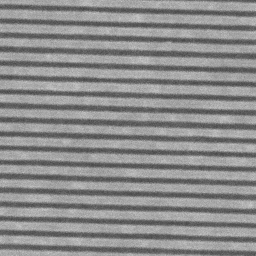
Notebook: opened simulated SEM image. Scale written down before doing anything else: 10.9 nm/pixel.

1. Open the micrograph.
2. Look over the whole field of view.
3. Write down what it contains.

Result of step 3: parallel lines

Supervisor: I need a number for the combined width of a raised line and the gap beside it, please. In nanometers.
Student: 154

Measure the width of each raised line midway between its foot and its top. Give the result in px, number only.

7.62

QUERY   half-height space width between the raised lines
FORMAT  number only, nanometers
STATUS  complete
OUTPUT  64